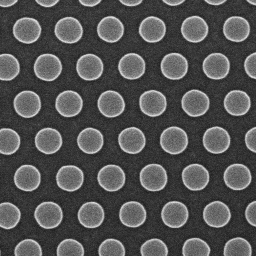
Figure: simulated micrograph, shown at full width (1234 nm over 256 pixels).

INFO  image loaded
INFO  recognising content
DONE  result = a regular array of raised bodies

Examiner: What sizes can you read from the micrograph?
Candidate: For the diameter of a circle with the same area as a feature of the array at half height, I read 126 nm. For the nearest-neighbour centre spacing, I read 202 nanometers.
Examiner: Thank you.